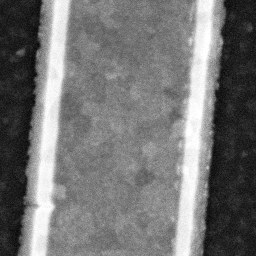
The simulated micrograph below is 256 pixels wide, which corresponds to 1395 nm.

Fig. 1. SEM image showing one or a few lines or trenches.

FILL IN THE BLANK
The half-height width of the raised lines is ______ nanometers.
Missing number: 796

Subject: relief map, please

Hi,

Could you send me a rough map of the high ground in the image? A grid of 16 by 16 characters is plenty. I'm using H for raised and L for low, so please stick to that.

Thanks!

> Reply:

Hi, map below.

LLLLHHHHHHHHHLLL
LLLLHHHHHHHHHLLL
LLLLHHHHHHHHHLLL
LLLHHHHHHHHHHLLL
LLLHHHHHHHHHHLLL
LLLHHHHHHHHHLLLL
LLLHHHHHHHHHLLLL
LLLHHHHHHHHHLLLL
LLLHHHHHHHHHLLLL
LLLHHHHHHHHHLLLL
LLLHHHHHHHHHLLLL
LLLHHHHHHHHHLLLL
LLLHHHHHHHHHLLLL
LLLHHHHHHHHHLLLL
LLHHHHHHHHHHLLLL
LLHHHHHHHHHLLLLL